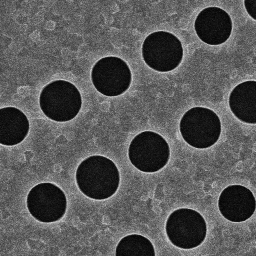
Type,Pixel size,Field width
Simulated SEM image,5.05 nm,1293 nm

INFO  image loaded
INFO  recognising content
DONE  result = a regular array of holes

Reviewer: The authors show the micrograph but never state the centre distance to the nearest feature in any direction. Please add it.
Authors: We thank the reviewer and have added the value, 288 nanometers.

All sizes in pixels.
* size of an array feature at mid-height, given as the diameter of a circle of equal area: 41.3